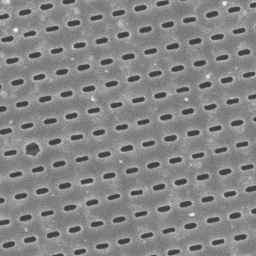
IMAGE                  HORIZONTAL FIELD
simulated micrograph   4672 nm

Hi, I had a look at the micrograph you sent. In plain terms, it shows a regular array of holes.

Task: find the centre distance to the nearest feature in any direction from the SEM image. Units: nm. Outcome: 402